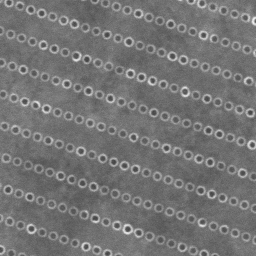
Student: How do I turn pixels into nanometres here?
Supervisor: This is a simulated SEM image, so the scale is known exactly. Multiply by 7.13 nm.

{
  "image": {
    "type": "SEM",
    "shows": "a regular array of holes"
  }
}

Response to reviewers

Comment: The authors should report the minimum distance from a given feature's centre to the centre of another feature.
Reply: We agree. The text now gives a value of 81.1 nm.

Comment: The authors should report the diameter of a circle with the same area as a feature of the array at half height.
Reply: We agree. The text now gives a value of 49 nm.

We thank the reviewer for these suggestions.